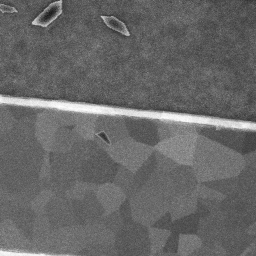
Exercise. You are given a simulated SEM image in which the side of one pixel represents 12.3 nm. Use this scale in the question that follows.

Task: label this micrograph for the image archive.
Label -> one or a few lines or trenches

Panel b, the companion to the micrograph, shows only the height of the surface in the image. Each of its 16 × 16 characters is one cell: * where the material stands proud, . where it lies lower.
................
................
................
................
................
................
***.............
************....
****************
****************
****************
****************
****************
****************
****************
****************